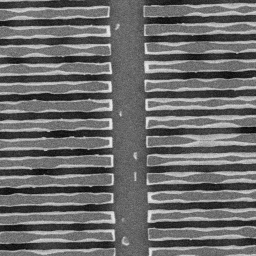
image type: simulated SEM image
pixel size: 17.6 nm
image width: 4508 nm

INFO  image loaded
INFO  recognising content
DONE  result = groups of lines, slits or small figures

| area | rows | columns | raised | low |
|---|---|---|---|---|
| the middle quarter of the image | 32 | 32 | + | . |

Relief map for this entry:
++++++++++++.........+++++++++++
++++++++++++.........+++++++++++
................................
................................
.....+++++..........++++++++++++
++++++++++++........++++++++++++
++++++++++++........+++...+++...
................................
................................
++++++++++++.........+++++++++++
++++++++++++.........+++++++++++
+++++++++.......................
................................
..........................++..++
++++++++++++.........+++++++++++
++++++++++++.........+++++++++++
................................
................................
++++++++++...........+++++++++++
++++++++++++.........+++++++++++
++++++++++++.........++++++.....
................................
................................
++++++++++++.........+++++++++++
++++++++++++.........+++++++++++
..........++....................
................................
.........++..........+++++++..++
++++++++++++.........+++++++++++
++++++++++++.........+++++++++++
................................
................................